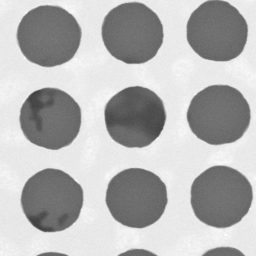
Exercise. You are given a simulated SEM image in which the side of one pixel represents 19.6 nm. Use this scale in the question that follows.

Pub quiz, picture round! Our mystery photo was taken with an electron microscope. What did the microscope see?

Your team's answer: a regular array of holes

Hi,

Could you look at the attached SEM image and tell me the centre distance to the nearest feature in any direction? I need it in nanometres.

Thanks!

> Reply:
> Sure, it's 1610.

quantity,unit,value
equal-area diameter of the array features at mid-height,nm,1220